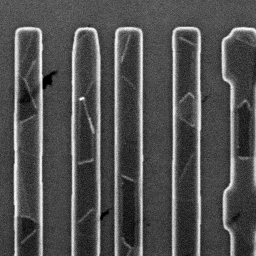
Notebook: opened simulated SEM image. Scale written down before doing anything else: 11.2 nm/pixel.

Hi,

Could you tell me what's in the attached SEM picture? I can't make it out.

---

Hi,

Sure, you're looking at wiring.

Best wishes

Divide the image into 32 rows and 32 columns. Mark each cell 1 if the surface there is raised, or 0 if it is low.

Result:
00000000000000000000000000000000
00000000000000000000000000000000
00000000000000000000000000000000
00000000000000000000000000000000
00111000011100011100001110000111
00111000011100011100001110001111
00111000011100011100001110001111
00111000011100011100001110001111
00111000011100011100001110001111
00111000011100011100001110001111
00111000011100011100001110000111
00111000011100011100001110000111
00111000011100011100001110000111
00111000011100011100001110000111
00111000011100011100001110000111
00111000011100011100001110000111
00111000011100011100001110000111
00111000011100011100001110000111
00111000011100011100001110000111
00111000011100011100001110000111
00111000011100011100001110000111
00111000011100011100001110000111
00111000011100011100001110000111
00111000011100011100001110000111
00111000011100011100001110001111
00111000011100011100001110001111
00111000011100011100001110001111
00111000011100011100001110001111
00111000011100011100001110001111
00111000011100011100001110000111
00111000011100011100001110000111
00111000011100011100001110000111